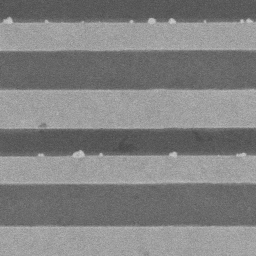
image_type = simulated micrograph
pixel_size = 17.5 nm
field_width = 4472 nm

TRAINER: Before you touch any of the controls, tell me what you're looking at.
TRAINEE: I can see lines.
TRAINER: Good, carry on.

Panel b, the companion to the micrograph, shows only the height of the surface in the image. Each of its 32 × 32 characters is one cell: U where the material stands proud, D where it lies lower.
DDDDDDDDDDDDDDDDDDDDDDDDDDDDDDDD
DDDDDDDDDDDDDDDDDDDDDDDDDDDDDDDD
DDDDDDDDDDDDDDDDDDDDDUDDDDDDDDDD
UUUUUUUUUUUUUUUUUUUUUUUUUUUUUUUU
UUUUUUUUUUUUUUUUUUUUUUUUUUUUUUUU
UUUUUUUUUUUUUUUUUUUUUUUUUUUUUUUU
DDDDDDDDDDDDDDDDDDDDDDDDDDDDDDDD
DDDDDDDDDDDDDDDDDDDDDDDDDDDDDDDD
DDDDDDDDDDDDDDDDDDDDDDDDDDDDDDDD
DDDDDDDDDDDDDDDDDDDDDDDDDDDDDDDD
DDDDDDDDDDDDDDDDDDDDDDDDDDDDDDDD
UUUUUUUUUUUUUUUUUUUUUUUUUUUUUUUU
UUUUUUUUUUUUUUUUUUUUUUUUUUUUUUUU
UUUUUUUUUUUUUUUUUUUUUUUUUUUUUUUU
UUUUUUUUUUUUUUUUUUUUUUUUUUUUUUUU
UUUUUUUUUUUUUUUUUUUUUUUUUUUUUUUU
DDDDDDDDDDDDDDDDDDDDDDDDDDDDDDDD
DDDDDDDDDDDDDDDDDDDDDDDDDDDDDDDD
DDDDDDDDDDDDDDDDDDDDDDDDDDDDDDDD
DDDDDUDDDUUDUDDDDDDDDUUDDDDUDUUD
UUUUUUUUUUUUUUUUUUUUUUUUUUUUUUUU
UUUUUUUUUUUUUUUUUUUUUUUUUUUUUUUU
UUUUUUUUUUUUUUUUUUUUUUUUUUUUUUUU
DDDDDDDDDDDDDDDDDDDDDDDDDDDDDDDD
DDDDDDDDDDDDDDDDDDDDDDDDDDDDDDDD
DDDDDDDDDDDDDDDDDDDDDDDDDDDDDDDD
DDDDDDDDDDDDDDDDDDDDDDDDDDDDDDDD
DDDDDDDDDDDDDDDDDDDDDDDDDDDDDDDD
UUUUUUUUUUUUUUUUUUUUUUUUUUUUUUUU
UUUUUUUUUUUUUUUUUUUUUUUUUUUUUUUU
UUUUUUUUUUUUUUUUUUUUUUUUUUUUUUUU
UUUUUUUUUUUUUUUUUUUUUUUUUUUUUUUU